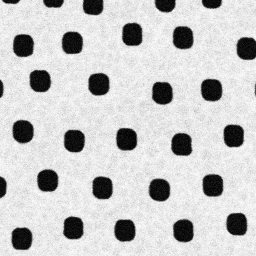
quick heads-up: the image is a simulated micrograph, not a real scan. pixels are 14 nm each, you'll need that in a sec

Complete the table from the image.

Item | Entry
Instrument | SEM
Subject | a regular array of holes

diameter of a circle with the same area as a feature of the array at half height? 0.317 µm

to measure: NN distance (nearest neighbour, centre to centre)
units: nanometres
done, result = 688